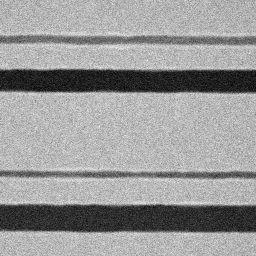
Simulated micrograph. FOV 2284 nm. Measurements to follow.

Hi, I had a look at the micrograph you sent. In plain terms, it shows lines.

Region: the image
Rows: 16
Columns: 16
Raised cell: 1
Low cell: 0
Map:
1111111111111111
1111111111111111
1111111111111111
1111111111111111
0000000000000000
0000000000000000
1111111111111111
1111111111111111
1111111111111111
1111111111111111
1111111111111111
1111111111111111
1111111111111111
0000000000000000
1000000000000000
1111111111111111